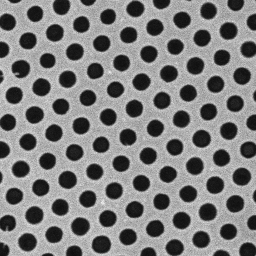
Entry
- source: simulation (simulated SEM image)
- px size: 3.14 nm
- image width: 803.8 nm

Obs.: a regular array of holes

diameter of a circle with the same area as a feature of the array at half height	53	nm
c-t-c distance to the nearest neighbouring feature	0.0858	µm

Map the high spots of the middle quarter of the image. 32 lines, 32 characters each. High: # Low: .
######....##....#########..####.
######....###..#########....###.
...###....#########.####.....###
...####..#########...###....####
...#########.####....####.######
..#########....##....#########..
###########....###..#########...
####....###...#########...###...
####....###############....##...
.###....########...###.....#####
.####.##########....###...######
.#########..###.....############
#########....###...#########...#
####.####....##############....#
##....###....#########..###....#
##....###############....###...#
##....#########..####....#######
####.#########....###...########
########..####....##############
#######....###....########...###
#...###....###############....##
#....###...#########...###....##
#....##############....####..###
#...#########...###....#########
############....####..#########.
######...###....###############.
######....###...########....###.
..####....##############....####
...###...#########...###....####
...##############....####..#####
...########...###....##########.
###########....###...########...